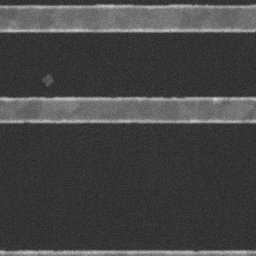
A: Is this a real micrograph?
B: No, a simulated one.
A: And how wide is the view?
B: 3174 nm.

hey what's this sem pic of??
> lines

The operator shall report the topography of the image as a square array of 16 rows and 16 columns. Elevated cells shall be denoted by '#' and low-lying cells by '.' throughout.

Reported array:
################
################
................
................
................
................
################
################
................
................
................
................
................
................
................
................